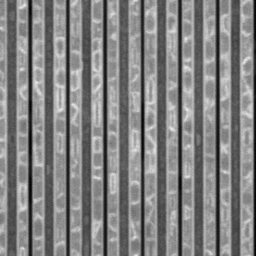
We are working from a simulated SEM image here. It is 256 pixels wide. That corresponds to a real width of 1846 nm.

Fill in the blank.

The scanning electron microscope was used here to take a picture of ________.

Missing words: parallel lines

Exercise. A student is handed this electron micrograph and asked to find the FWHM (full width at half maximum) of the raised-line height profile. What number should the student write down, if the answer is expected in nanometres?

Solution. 82.1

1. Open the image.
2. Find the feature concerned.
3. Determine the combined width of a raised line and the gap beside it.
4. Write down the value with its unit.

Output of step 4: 135 nm